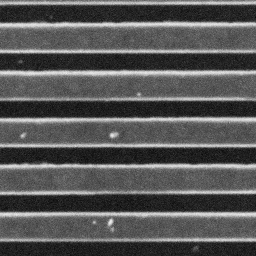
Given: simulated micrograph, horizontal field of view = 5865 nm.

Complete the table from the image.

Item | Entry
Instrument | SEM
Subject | lines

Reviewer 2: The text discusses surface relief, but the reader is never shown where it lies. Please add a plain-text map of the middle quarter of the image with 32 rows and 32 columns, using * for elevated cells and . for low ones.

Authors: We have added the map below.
................................
................................
********************************
********************************
********************************
********************************
********************************
********************************
********************************
................................
................................
................................
................................
..............................**
********************************
********************************
********************************
********************************
********************************
********************************
********************************
................................
................................
................................
................................
********************************
********************************
********************************
********************************
********************************
********************************
********************************